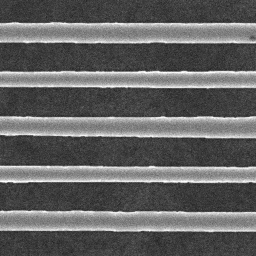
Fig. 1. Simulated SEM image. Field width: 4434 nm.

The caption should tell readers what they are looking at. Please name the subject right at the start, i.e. lines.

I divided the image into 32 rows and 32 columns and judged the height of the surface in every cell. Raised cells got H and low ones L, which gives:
LLLLLLLLLLLLLLLLLLLLLLLLLLLLLLLL
LLLLLLLLLLLLLLLLLLLLLLLLLLLLLLLL
LLLLLLLLLLLLLLLLLLLLLLLLLLLLLLLL
HHHHHHHHHHHHHHHHHHHHHHHHHHHHHHHH
HHHHHHHHHHHHHHHHHHHHHHHHHHHHHHHH
LLLLLLLLLLLLLLLLLLLLLLLLLLLLLLLL
LLLLLLLLLLLLLLLLLLLLLLLLLLLLLLLL
LLLLLLLLLLLLLLLLLLLLLLLLLLLLLLLL
LLLLLLLLLLLLLLLLLLLLLLLLLLLLLLLL
HHHHHHHHHHHHHHHHHHHHHHHHHHHHHHHH
HHHHHHHHHHHHHHHHHHHHHHHHHHHHHHHH
LLLLLLLLLLLLLLLLLLLLLLLLLLLLLLLL
LLLLLLLLLLLLLLLLLLLLLLLLLLLLLLLL
LLLLLLLLLLLLLLLLLLLLLLLLLLLLLLLL
LLLLLLLLLLLLLLLLLLLLLLLLLLLLLLLL
HHHHHHHHHHHHHHHHHHHHHHHHHHHHHHHH
HHHHHHHHHHHHHHHHHHHHHHHHHHHHHHHH
LLLLLLLLLLLLLLLLLLLLLLLLLLLLLLLL
LLLLLLLLLLLLLLLLLLLLLLLLLLLLLLLL
LLLLLLLLLLLLLLLLLLLLLLLLLLLLLLLL
LLLLLLLLLLLLLLLLLLLLLLLLLLLLLLLL
HHHHHHHHHHHHHHHHHHHHHHHHHHHHHHHH
HHHHHHHHHHHHHHHHHHHHHHHHHHHHHHHH
LLLLLLLLLLLLLLLLLLLLLLLLLLLLLLLL
LLLLLLLLLLLLLLLLLLLLLLLLLLLLLLLL
LLLLLLLLLLLLLLLLLLLLLLLLLLLLLLLL
HHHHHHHHHHHHHHLLLHHHHLHLLLLLLLLL
HHHHHHHHHHHHHHHHHHHHHHHHHHHHHHHH
HHHHHHHHHHHHHHHHHHHHHHHHHHHHHHHH
LLLLLLLLLLLLLLLLLLLLLLLLLLLLLLLL
LLLLLLLLLLLLLLLLLLLLLLLLLLLLLLLL
LLLLLLLLLLLLLLLLLLLLLLLLLLLLLLLL